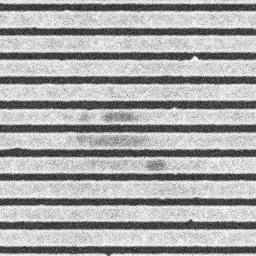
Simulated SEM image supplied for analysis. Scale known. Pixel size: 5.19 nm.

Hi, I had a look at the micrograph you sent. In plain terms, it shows parallel lines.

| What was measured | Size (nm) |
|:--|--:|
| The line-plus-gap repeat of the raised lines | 126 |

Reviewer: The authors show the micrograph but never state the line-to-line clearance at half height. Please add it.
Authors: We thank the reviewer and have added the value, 0.0506 micrometres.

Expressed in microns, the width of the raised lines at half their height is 0.0779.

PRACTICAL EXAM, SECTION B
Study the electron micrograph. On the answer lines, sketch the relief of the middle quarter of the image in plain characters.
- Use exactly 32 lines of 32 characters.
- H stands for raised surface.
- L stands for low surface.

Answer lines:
HHHHHHHHHHHHHHHHHHHHHHHHHHHHHHHH
HHHHHHHHHHHHHHHHHHHHHHHHHHHHHHHH
HHHHHHHHHHHHHHHHHHHHHHHHHHHHHHHH
LLLLLLLLLLLLLLLLLLLLLLLLLLLLLLLL
LLLLLLLLLLLLLLLLLLLLLLLLLLLLLLLL
HHHHHHHHHHHHHHHHHHHHHHHHHHHHHHHH
HHHHHHHHHHHHHHHHHHHHHHHHHHHHHHHH
HHHHHHHHHHHHHHHHHHHHHHHHHHHHHHHH
HHHHHHHHHHHHHHHHHHHHHHHHHHHHHHHH
LLLLLLLLLLLLLLLLLLLLLLLLLLLLLLLL
LLLLLLLLLLLLLLLLLLLLLLLLLLLLLLLL
LLLLLLLLLLLLLLLLLHHLLLLLHLLHLLLL
HHHHHHHHHHHHHHHHHHHHHHHHHHHHHHHH
HHHHHHHHHHHHHHHHHHHHHHHHHHHHHHHH
HHHHHHHHHHHHHHHHHHHHHHHHHHHHHHHH
LLLLLLLLLLLLLLLLLLLLLLLLLLLLLLLL
LLLLLLLLLLLLLLLLLLLLLLLLLLLLLLLL
HHHLLLHLLLHLHHHHHLLHHHHLHHHHHHHH
HHHHHHHHHHHHHHHHHHHHHHHHHHHHHHHH
HHHHHHHHHHHHHHHHHHHHHHHHHHHHHHHH
HHHHHHHHHHHHHHHHHHHHHHHHHHHHHHHH
LLLLLLLLLLLLLLLLLLLLLLLLLLLLLLLL
LLLLLLLLLLLLLLLLLLLLLLLLLLLLLLLL
LLLLLLLLLLLLLLLLLLLLLLLLLLLLLLLL
HHHHHHHHHHHHHHHHHHHHHHHHHHHHHHHH
HHHHHHHHHHHHHHHHHHHHHHHHHHHHHHHH
HHHHHHHHHHHHHHHHHHHHHHHHHHHHHHHH
LLLLLLLLLLLLLLLLLLLLLLLLLLLLLLLL
LLLLLLLLLLLLLLLLLLLLLLLLLLLLLLLL
LHLLHHHLLLLHLLLLLLLLLLHLLLLLLLLL
HHHHHHHHHHHHHHHHHHHHHHHHHHHHHHHH
HHHHHHHHHHHHHHHHHHHHHHHHHHHHHHHH